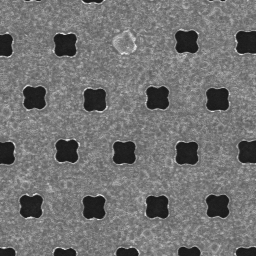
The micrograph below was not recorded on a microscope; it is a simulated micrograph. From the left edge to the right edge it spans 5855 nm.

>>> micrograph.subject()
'a regular array of holes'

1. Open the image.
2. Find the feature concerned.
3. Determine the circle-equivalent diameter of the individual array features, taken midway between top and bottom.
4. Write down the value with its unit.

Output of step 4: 563 nm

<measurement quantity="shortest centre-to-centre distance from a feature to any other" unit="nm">1380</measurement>